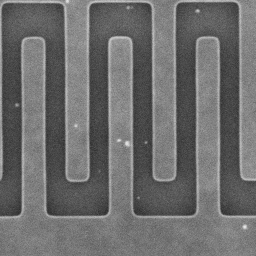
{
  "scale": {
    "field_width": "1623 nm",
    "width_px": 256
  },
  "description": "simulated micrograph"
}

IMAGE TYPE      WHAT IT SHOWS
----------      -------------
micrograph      groups of lines, slits or small figures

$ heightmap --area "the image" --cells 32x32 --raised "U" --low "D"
UDDDDDDDUUUUDDDDDDDUUUDDDDDDDDUU
DDDDDDDDUUUDDDDDDDDUUUDDDDDDDDUU
DDDDDDDDUUUDDDDDDDDUUUDDDDDDDDUU
DDDDDDDDUUUDDDDDDDDUUUDDDDDDDDUU
DDDDDDDDUUUDDDDDDDDUUUDDDDDDDDUU
DDDUUUDDUUUDDDUUDDDUUUDDDUUDDDUU
DDDUUUDDUUUDDDUUDDDUUUDDDUUDDDUU
DDDUUUDDUUUDDDUUDDDUUUDDDUUDDDUU
DDDUUUDDUUUDDDUUDDDUUUDDDUUDDDUU
DDDUUUDDUUUDDDUUDDDUUUDDDUUDDDUU
DDDUUUDDUUUDDDUUDDDUUUDDDUUDDDUU
DDDUUUDDUUUDDDUUDDDUUUDDDUUDDDUU
DDDUUUDDUUUDDDUUDDDUUUDDDUUDDDUU
DDDUUUDDUUUDDDUUDDDUUUDDDUUDDDUU
DDDUUUDDUUUDDDUUDDDUUUDDDUUDDDUU
DDDUUUDDUUUDDDUUDDDUUUDDDUUDDDUU
DDDUUUDDUUUDDDUUDDDUUUDDDUUDDDUU
DDDUUUDDUUUDDDUUDDDUUUDDDUUDDDUU
DDDUUUDDUUUDDDUUDDDUUUDDDUUDDDUU
DDDUUUDDUUUDDDUUDDDUUUDDDUUDDDUU
DDDUUUDDUUUDDDUUDDDUUUDDDUUDDDUU
DDDUUUDDUUUDDDUUDDDUUUDDDUUDDDUU
DDDUUUDDDUUDDDUUDDDDUDDDDUUDDDDU
DDDUUUDDDDDDDDUUDDDDDDDDDUUDDDDD
DDDUUUDDDDDDDDUUDDDDDDDDDUUDDDDD
DDDUUUDDDDDDDDUUDDDDDDDDDUUDDDDD
DDDUUUDDDDDDDDUUUDDDDDDDDUUUDDDD
UUUUUUUUUUUUUUUUUUUUUUUUUUUUUUUU
UUUUUUUUUUUUUUUUUUUUUUUUUUUUUUUU
UUUUUUUUUUUUUUUUUUUUUUUUUUUUUUUU
UUUUUUUUUUUUUUUUUUUUUUUUUUUUUUUU
UUUUUUUUUUUUUUUUUUUUUUUUUUUUUUUU